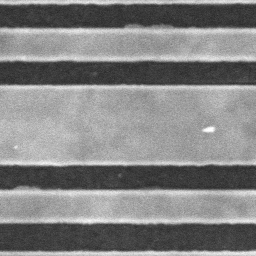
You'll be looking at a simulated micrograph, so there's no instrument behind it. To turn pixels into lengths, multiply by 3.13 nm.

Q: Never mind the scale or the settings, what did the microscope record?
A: lines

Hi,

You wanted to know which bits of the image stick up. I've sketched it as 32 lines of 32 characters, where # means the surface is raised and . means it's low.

####...##.#.##.#...#............
................................
................................
#...............................
################################
################################
################################
################################
................................
................................
................................
################################
################################
################################
################################
################################
################################
################################
################################
################################
################################
................................
................................
................................
################################
################################
################################
################################
................................
................................
................................
################################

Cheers